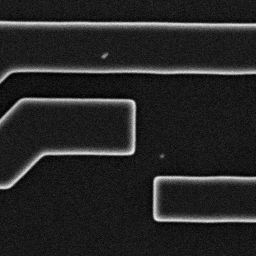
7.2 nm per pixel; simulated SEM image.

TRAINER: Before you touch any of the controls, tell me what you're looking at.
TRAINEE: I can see groups of lines, slits or small figures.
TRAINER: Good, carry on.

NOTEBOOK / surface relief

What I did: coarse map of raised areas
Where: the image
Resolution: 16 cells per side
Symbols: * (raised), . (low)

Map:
................
************....
****************
****************
*........*******
................
.*******........
********........
********........
********........
**..............
*.........******
..........******
..........******
................
................